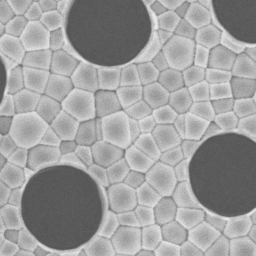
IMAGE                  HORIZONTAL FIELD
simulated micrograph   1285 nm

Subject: holes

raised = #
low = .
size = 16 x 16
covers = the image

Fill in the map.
####.....####...
####.....#####..
####.....######.
#####...########
################
################
################
################
#############..#
############....
###..#######....
##....######....
#.....######....
#.....########.#
##....##########
###..###########